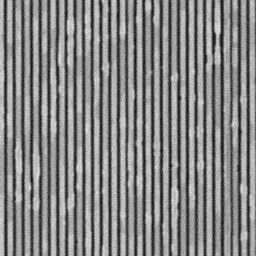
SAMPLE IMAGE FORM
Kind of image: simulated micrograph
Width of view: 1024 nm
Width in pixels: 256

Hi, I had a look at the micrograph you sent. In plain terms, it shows parallel lines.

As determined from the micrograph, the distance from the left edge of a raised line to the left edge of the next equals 34.6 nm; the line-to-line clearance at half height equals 0.016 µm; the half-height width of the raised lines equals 19.5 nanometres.